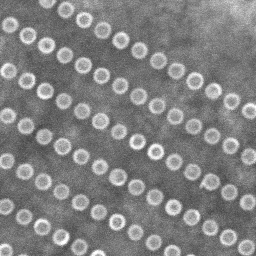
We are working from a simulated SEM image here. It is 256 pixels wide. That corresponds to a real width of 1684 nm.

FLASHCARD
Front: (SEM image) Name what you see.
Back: a regular array of raised bodies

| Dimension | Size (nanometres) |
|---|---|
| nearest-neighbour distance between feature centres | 137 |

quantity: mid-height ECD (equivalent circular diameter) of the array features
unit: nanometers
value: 98.3